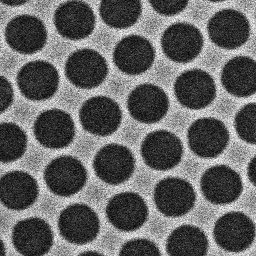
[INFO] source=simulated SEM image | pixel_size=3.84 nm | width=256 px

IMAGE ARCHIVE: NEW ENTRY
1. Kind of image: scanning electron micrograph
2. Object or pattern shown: a regular array of holes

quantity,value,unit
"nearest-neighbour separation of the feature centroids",0.186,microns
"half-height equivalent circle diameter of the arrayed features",160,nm